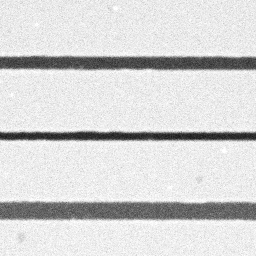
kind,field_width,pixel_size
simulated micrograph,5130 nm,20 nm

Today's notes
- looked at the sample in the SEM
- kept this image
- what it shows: lines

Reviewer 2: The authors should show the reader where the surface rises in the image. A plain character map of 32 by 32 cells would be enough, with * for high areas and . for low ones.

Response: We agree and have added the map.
********************************
********************************
********************************
********************************
********************************
********************************
********************************
................................
................................
********************************
********************************
********************************
********************************
********************************
********************************
********************************
.......................*.**.....
................................
********************************
********************************
********************************
********************************
********************************
********************************
********************************
................................
................................
....*...........................
********************************
********************************
********************************
********************************